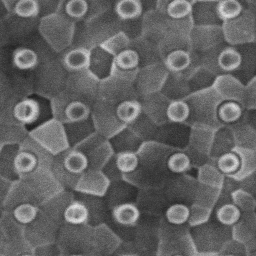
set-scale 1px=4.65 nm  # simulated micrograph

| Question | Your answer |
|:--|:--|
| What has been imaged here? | a regular array of raised bodies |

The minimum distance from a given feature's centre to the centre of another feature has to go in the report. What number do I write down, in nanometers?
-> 136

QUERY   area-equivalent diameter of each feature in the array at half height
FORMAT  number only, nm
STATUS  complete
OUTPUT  87.4